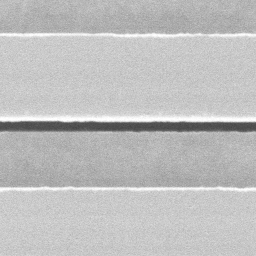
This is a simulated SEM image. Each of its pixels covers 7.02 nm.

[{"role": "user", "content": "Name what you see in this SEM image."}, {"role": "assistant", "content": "lines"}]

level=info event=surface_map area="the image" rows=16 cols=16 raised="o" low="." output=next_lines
................
................
oooooooooooooooo
oooooooooooooooo
oooooooooooooooo
oooooooooooooooo
oooooooooooooooo
oooooooooooooooo
................
................
................
................
oooooooooooooooo
oooooooooooooooo
oooooooooooooooo
oooooooooooooooo